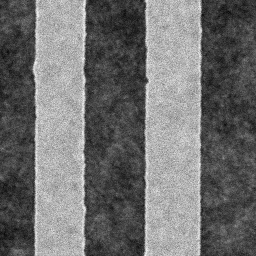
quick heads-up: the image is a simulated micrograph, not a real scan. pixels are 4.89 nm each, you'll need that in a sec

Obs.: one or a few lines or trenches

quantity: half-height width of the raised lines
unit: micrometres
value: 0.249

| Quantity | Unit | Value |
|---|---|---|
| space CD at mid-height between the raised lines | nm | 306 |